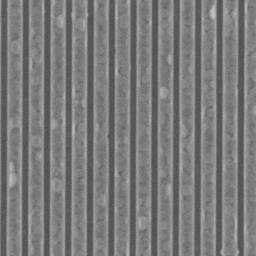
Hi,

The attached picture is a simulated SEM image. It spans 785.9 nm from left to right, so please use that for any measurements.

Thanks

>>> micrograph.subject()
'parallel lines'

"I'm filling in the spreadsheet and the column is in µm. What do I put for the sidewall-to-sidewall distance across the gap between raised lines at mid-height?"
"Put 0.0218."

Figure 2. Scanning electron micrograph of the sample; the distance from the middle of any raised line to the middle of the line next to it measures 21.5 pixels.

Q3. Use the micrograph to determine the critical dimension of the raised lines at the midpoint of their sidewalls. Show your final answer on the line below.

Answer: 0.0437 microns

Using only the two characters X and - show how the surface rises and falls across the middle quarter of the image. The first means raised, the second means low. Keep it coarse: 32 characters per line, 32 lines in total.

--XXXX--XXX--XXX--XXXX--XXX--XXX
--XXXX--XXX---XX--XXXX--XXX--XXX
--XXXX--XXX--XXX--XXXX--XXX--XXX
--XXXX--XXX--XXX--XXXX--XXX--XXX
--XXXX--XXX--XXX--XXXX--XXX--XXX
--XXXX--XXX--XXX--XXXX--XXX--XXX
--XXXX--XXX--XXX--XXXX--XXX--XXX
--XXXX--XXX--XXX--XXXX--XXX--XXX
--XXXX--XXX--XXX--XXXX--XXX--XXX
--XXXX--XXX--XXX--XXXX--XXX--XXX
--XXXX--XXX--XXX--XXXX--XXX--XXX
--XXXX--XXX--XXX--XXXX--XXX--XXX
--XXXX--XXX--XXX--XXXX--XXX--XXX
--XXXX--XXX--XXX--XXXX--XXX--XXX
--XXXX--XXX--XXX--XXXX--XXX--XXX
----XX--XXX--XXX--XXXX--XXX--XXX
----XX--XXX--XXX--XXXX--XXX--XXX
--XXXX--XXX--XXX--XXXX--XXX--XXX
--XXXX--XXX--XXX--XXXX--XXX--XXX
--XXXX--XXX--XXX--XXXX--XXX--XXX
--XXXX--XXX--XXX--XXXX--XXX--XXX
--XXXX--XXX--XXX--XXXX-XXXX--XXX
--XXXX--XXX--XXX--XXXX--XXX--XXX
--XXXX--XXX--XXX--XXXX--XXX--XXX
--XXXX--XXX--XXX--XXXX--XXX--XXX
--XXXX--XXX--XXX--XXXX--XXX--XXX
--XXXX--XXX--XXX--XXXX--XXX--XXX
--XXXX--XXX--X-X--XXXX--XXX--XXX
--XXXX--XXX--X-X--XXXX--XXX--XXX
--XXXX--XXX--XXX--XXXX--XXX--XXX
--XXXX--XXX--XXX--XXXX--XXX--XXX
--XXX---XXX--XXX--XXXX--XXX--XXX